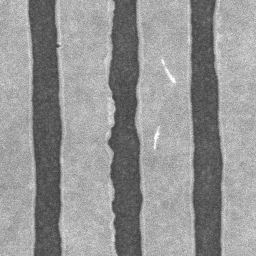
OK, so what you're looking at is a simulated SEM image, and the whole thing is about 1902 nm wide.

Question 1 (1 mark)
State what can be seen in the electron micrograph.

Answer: one or a few lines or trenches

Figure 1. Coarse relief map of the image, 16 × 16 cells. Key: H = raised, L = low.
HHLLHHHLLHHHLLHH
HHLLHHHLLHHHLHHH
HHLLHHHLLHHHLHHH
HHLLHHHLLHHHLLHH
HHLLHHHLLHHHLLHH
HHLLHHHLLHHHLLHH
HHLLHHHLLHHHLLHH
HHLLHHHLLHHHLLHH
HHLLHHHLLHHHLLHH
HHLLHHHLLHHHLLHH
HHLLHHHLLHHHLLHH
HHLLHHHLLHHHLLHH
HHLLHHHLLHHHLLHH
HHLLHHHLLHHHLLHH
HHLLHHHLLHHHLLHH
HHLLHHHLLHHHLLHH